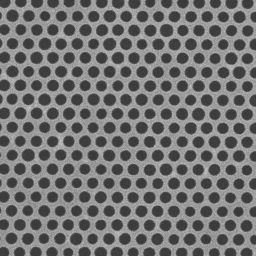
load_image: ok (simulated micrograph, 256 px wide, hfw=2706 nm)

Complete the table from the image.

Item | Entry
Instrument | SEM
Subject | a regular array of holes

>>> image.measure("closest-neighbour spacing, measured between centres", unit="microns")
0.167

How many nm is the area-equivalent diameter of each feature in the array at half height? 125